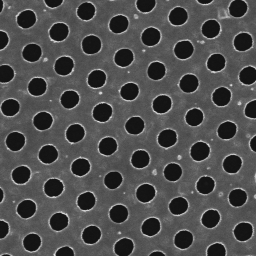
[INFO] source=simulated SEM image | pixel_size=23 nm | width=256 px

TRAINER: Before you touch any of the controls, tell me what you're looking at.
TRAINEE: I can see a regular array of holes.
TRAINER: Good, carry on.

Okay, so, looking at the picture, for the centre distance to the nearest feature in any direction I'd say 0.781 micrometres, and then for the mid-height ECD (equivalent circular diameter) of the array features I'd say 425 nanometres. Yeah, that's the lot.